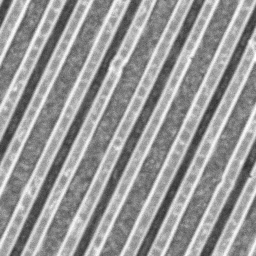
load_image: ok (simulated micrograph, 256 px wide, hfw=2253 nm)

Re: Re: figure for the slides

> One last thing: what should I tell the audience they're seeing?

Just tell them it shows parallel lines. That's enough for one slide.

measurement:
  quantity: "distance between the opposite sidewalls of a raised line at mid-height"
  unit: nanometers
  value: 107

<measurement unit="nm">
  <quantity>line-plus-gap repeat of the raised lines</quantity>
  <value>252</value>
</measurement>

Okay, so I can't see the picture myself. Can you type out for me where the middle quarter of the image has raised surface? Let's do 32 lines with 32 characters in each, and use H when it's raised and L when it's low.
LLLLLHHHHLLHHHHLLLLLLHHHLLLLHHHL
LLLLLHHHLLLHHHLLLLLLHHHHLLLHHHLL
LLLLHHHHLLLHHHLLLLLLHHHHLLLHHHLL
LLLLHHHLLLHHHHLLLLLLHHHLLLLHHHLL
LLLHHHHLLLHHHLLLLLLHHHHLLLHHHLLL
LLLHHHLLLHHHHLLLLLLHHHLLLLHHHLLL
LLHHHHLLLHHHLLLLLLHHHHLLLHHHLLLL
LLHHHLLLLHHHLLLLLLHHHLLLLHHHLLLL
LHHHHLLLHHHLLLLLLHHHLLLLHHHLLLLL
LHHHLLLLHHHLLLLLLHHHLLLLHHHLLLLL
HHHHLLLHHHLLLLLLHHHLLLLHHHLLLLLL
HHHLLLLHHHLLLLLLHHHLLLLHHHLLLLLL
HHHLLLHHHLLLLLLHHHHLLLHHHLLLLLLH
HHLLLLHHHLLLLLLHHHLLLLHHHLLLLLLH
HHLLLHHHLLLLLLHHHHLLLHHHLLLLLLHH
HLLLLHHHLLLLLLHHHLLLLHHHLLLLLLHH
HLLLHHHHLLLLLHHHHLLLHHHLLLLLLHHH
LLLLHHHLLLLLLHHHLLLLHHHLLLLLLHHH
LLLHHHHLLLLLHHHHLLLHHHLLLLLLHHHH
LLLHHHLLLLLLHHHLLLLHHHLLLLLLHHHH
LLHHHHLLLLLHHHHLLLHHHLLLLLLHHHHL
LLHHHLLLLLLHHHLLLLHHHLLLLLLHHHHL
LHHHHLLLLLLHHHLLLHHHHLLLLLHHHHLL
LHHHLLLLLLHHHLLLLHHHLLLLLLHHHHLL
HHHHLLLLLLHHHLLLHHHHLLLLLHHHHLLL
HHHLLLLLLHHHLLLLHHHLLLLLLHHHHLLL
HHHLLLLLLHHHLLLHHHHLLLLLHHHHLLLH
HHLLLLLLHHHLLLLHHHLLLLLLHHHHLLLH
HHLLLLLLHHHLLLHHHHLLLLLHHHHLLLHH
HLLLLLLHHHHLLLHHHLLLLLLHHHHLLLHH
HLLLLLLHHHLLLHHHHLLLLLLHHHLLLHHH
LLLLLLHHHHLLLHHHLLLLLLHHHHLLLHHH